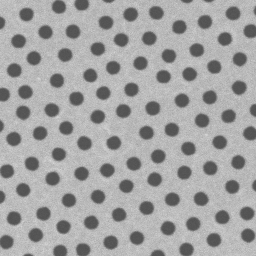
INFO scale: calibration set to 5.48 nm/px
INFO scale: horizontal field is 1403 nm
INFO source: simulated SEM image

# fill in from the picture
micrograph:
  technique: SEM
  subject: a regular array of holes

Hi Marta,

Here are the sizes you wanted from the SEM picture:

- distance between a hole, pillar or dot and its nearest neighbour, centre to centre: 138 nm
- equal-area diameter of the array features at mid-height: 13.2 pixels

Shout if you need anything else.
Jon